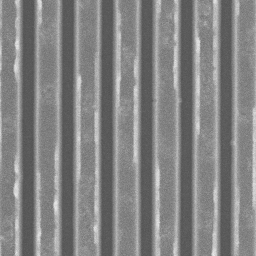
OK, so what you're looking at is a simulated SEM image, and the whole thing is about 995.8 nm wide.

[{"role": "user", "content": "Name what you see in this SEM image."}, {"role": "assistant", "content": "parallel lines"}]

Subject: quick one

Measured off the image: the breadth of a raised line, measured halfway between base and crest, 24.9 px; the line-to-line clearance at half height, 58.8 nm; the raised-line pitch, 154 nanometres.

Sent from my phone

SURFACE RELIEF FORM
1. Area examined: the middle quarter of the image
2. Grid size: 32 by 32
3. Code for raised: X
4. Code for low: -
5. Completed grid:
---XXXXXX----XXXXXX----XXXXXX---
---XXXXXX----XXXXXX----XXXXX----
---XXXXXX----XXXXXX----XXXXXX---
---XXXXXX----XXXXXX----XXXXXX---
---XXXXXX----XXXXXX----XXXXXX---
---XXXXXX----XXXXXX----XXXXXX---
---XXXXXX----XXXXXX----XXXXXX---
---XXXXXX----XXXXXX----XXXXXX---
---XXXXXX----XXXXXX----XXXXXX---
---XXXXXX----XXXXXX----XXXXXX---
---XXXXXX----XXXXXX----XXXXXX---
---XXXXXX----XXXXXX----XXXXXX---
---XXXXXX----XXXXXX----XXXXXX---
---XXXXXX----XXXXXX----XXXXXX---
---XXXXXX----XXXXXX----XXXXXX---
---XXXXXX----XXXXXX----XXXXXX---
---XXXXXX----XXXXXX----XXXXXX---
---XXXXXX----XXXXXX----XXXXXX---
---XXXXXX----XXXXXX----XXXXXX---
---XXXXXX----XXXXXX----XXXXXX---
---XXXXXX----XXXXXX----XXXXXX---
---XXXXXX----XXXXXX----XXXXXX---
---XXXXXX----XXXXXX----XXXXXX---
---XXXXXX----XXXXXX----XXXXXX---
---XXXXXX----XXXXXX----XXXXXX---
---XXXXXX----XXXXXX----XXXXXX---
---XXXXXX----XXXXXX----XXXXXX---
---XXXXXX----XXXXXX----XXXXXX---
---XXXXXX----XXXXXX----XXXXXX---
---XXXXXX----XXXXXX----XXXXXX---
---XXXXXX----XXXXXX----XXXXXX---
---XXXXXX----XXXXXX----XXXXXX---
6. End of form